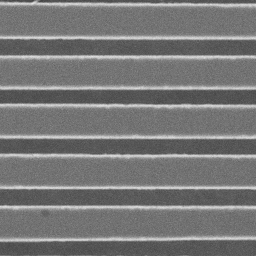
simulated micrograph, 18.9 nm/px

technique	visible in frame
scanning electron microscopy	lines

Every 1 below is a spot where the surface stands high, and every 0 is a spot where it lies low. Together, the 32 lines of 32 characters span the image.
11111111111111111110111100000000
11111111111111111111111111111111
11111111111111111111111111111111
11111111111111111111111111111111
11111111111111111111111111111111
00000000000000000000000000000000
00000000000000000000000000000000
11111111111111111111111111111111
11111111111111111111111111111111
11111111111111111111111111111111
11111111111111111111111111111111
00000000000000000000000000000000
00000000000000000000000000000000
11111111111111111111111111111111
11111111111111111111111111111111
11111111111111111111111111111111
11111111111111111111111111111111
00000000000000000000000000000000
00000000000000000000000000000000
11111111111111111111111111111111
11111111111111111111111111111111
11111111111111111111111111111111
11111111111111111111111111111111
11111111111111111111111111111111
00000000000000000000000000000000
00000000000000000000000000000000
11111111111111111111111111111111
11111111111111111111111111111111
11111111111111111111111111111111
11111111111111111111111111111111
00000000000000000000000000000000
00000000000000000000000000000000